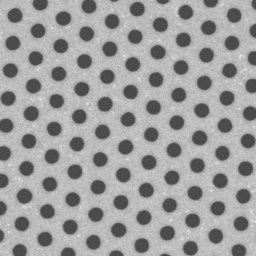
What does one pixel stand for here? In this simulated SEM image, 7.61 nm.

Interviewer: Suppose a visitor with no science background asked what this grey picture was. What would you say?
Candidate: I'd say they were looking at a regular array of holes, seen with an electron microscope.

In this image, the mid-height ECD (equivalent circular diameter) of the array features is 110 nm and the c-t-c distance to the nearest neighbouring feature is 210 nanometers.